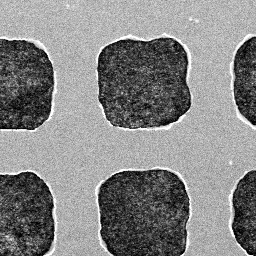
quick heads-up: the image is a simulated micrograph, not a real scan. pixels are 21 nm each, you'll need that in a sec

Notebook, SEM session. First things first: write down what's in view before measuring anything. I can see holes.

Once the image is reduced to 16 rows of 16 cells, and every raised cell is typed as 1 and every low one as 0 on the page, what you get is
1111111111111111
1111111111111111
0011111111011111
0001110000001110
0001110000001110
0001110000001110
0001110000001110
0001111000011110
1111111111111111
1111111111111111
1111111111111111
0001110000011110
0001110000001110
0001110000001110
0001110000001110
0001111000001110